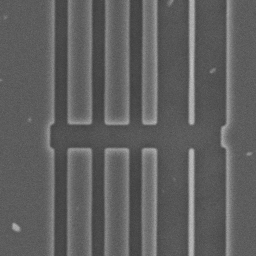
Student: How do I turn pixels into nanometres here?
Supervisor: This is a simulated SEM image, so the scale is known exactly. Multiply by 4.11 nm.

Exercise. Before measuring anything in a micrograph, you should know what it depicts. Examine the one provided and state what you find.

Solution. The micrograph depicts groups of lines, slits or small figures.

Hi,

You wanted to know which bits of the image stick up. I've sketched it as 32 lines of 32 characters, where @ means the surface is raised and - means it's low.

@@@@@@@--@@--@@@--@@---------@@@
@@@@@@@--@@--@@@--@@---------@@@
@@@@@@@--@@--@@@--@----------@@@
@@@@@@@--@@--@@@--@----------@@@
@@@@@@@--@@--@@@--@@---------@@@
@@@@@@@--@@--@@@--@@---------@@@
@@@@@@@--@@--@@@--@@---------@@@
@@@@@@@--@@--@@@--@@--------@@@@
@@@@@@@--@@--@@@--@@--------@@@@
@@@@@@@--@@--@@@--@@--------@@@@
@@@@@@@--@@--@@@--@@--------@@@@
@@@@@@@--@@--@@@--@@--------@@@@
@@@@@@@--@@--@@@--@@--------@@@@
@@@@@@@--@@--@@@--@@--------@@@@
@@@@@@@--@@--@@@--@---------@@@@
@@@@@@----------------------@@@@
@@@@@@----------------------@@@@
@@@@@@----------------------@@@@
@@@@@@----------------------@@@@
@@@@@@@--@@--@@@--@---------@@@@
@@@@@@@--@@--@@@--@---------@@@@
@@@@@@@--@@--@@@--@---------@@@@
@@@@@@@--@@--@@@--@---------@@@@
@@@@@@@--@@--@@@--@---------@@@@
@@@@@@@--@@--@@@--@---------@@@@
@@@@@@@--@@--@@@--@---------@@@@
@@@@@@@--@@--@@@--@---------@@@@
@@@@@@@--@@--@@@--@---------@@@@
@@@@@@@--@@--@@@--@---------@@@@
@@@@@@@--@@--@@@--@---------@@@@
@@@@@@@--@@--@@@--@---------@@@@
@@@@@@@--@@--@@@--@---------@@@@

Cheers